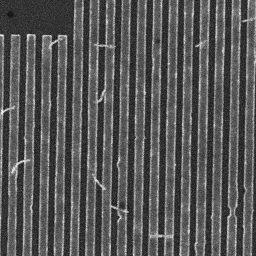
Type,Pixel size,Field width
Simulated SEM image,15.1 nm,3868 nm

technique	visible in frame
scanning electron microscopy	parallel lines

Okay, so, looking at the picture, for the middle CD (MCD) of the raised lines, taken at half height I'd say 126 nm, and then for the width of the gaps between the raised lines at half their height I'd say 106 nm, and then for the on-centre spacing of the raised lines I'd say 0.238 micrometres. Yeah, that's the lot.